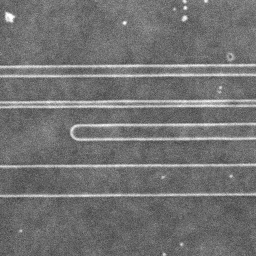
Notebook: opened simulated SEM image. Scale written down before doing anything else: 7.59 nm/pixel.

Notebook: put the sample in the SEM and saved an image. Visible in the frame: groups of lines, slits or small figures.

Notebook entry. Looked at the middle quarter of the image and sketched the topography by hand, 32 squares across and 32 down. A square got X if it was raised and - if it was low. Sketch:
------XXXXXXXXXXXXXXXXXXXXXXXXXX
XXXXXXXXXXXXXXXXXXXXXXXXXXXXXXXX
XXXXXXXXXXXXXXXXXXXXXXXXXXXXXXXX
--------------------------------
--------------------------------
--------------------------------
--------------------------------
--------------------------------
--------------------------------
--------XXXXXXXXXXXXXXXXXXXXXXXX
XXXXXXXXXXXXXXXXXXXXXXXXXXXXX---
--------------------------------
--------------------------------
--------------------------------
--------------------------------
--XXXXXXXXXXXXXXXXXXXXXXXXXXXXXX
--XXXXXXXXXXXXXXXXXXXXXXXXXXXXXX
--XXXXXXXXXXXXXXXXXXXXXXXXXXXXXX
--XXXXXXXXXXXXXXXXXXXXXXXXXXXXXX
--------------------------------
--------------------------------
--------------------------------
--------------------------------
--------------------------------
--------------------------------
XXXXXXXXXXXXXXXXXXXXXXXXXXXXXXXX
XXXXXXXXXXXXXXXXXXXXXXXXXXXXXXXX
XXXXXXXXXXXXXXXXXXXXXXXXXXXXXXXX
XXXXXXXXXXXXXXXXXXXXXXXXXXXXXXXX
XXXXXXXXXXXXXXXXXXXXXXXXXXXXXXXX
XXXXXXXXXXXXXXXXXXXXXXXXXXXXXXXX
XXXXXXXXXXXXXXXXXXXXXXXXXXXXXXXX